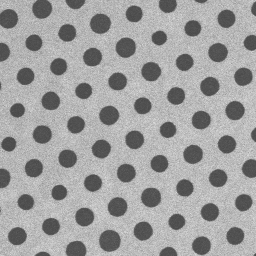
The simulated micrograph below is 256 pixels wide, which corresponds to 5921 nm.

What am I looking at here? a regular array of holes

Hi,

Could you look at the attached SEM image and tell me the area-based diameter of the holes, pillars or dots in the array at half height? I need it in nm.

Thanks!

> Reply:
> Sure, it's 419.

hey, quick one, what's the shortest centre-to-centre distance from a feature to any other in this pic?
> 800 nanometers